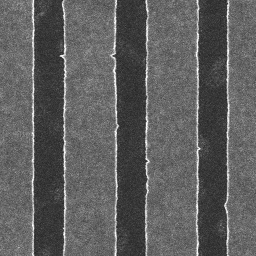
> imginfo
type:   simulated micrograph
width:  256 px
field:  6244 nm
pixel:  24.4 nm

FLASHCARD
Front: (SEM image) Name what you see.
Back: one or a few lines or trenches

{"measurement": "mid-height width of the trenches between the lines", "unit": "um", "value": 0.715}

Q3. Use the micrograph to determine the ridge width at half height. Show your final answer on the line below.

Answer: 1270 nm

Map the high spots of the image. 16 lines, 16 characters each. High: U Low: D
UUDDUUUDDUUUDDUU
UUDDUUUDDUUUDDUU
UUDDUUUDDUUUDDUU
UUDDUUUDDUUUDDUU
UUDDUUUDDUUUDDUU
UUDDUUUDDUUUDDUU
UUDDUUUDDUUUDDUU
UUDDUUUDDUUUDDUU
UUDDUUUDDUUUDDUU
UUDDUUUDDUUUDDUU
UUDDUUUDDUUUDDUU
UUDDUUUDDUUUDDUU
UUDDUUUDDUUUDDUU
UUDDUUUDDUUUDDUU
UUDDUUUDDUUUDDUU
UUDDUUUDDUUUDDUU